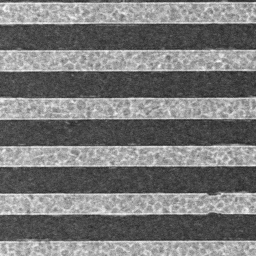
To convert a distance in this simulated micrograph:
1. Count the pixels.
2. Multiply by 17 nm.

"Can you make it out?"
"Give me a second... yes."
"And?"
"parallel lines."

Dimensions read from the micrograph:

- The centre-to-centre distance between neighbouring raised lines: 0.814 um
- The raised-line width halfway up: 339 nm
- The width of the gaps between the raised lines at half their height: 479 nm